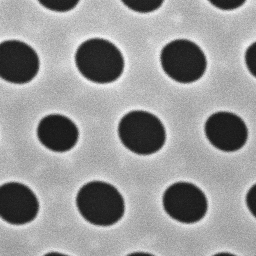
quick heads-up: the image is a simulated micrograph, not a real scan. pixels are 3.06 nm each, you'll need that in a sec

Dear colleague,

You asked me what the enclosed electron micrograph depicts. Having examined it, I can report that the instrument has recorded holes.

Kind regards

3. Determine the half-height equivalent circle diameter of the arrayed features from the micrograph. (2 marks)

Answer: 142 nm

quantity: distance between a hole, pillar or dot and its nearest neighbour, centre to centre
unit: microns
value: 0.252